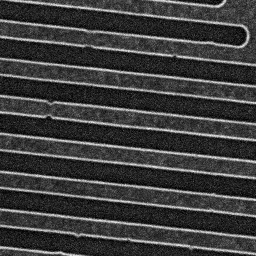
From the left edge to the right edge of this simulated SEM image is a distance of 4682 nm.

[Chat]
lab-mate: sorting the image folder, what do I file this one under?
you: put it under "parallel lines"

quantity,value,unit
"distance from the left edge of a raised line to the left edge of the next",686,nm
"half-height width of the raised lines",300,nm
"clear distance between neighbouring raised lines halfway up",386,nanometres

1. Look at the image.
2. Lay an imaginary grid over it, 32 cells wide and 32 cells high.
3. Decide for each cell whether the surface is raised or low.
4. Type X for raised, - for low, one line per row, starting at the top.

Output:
------XXXXXXXXXXXXXXXXXX----XXXX
---------------XXXXXXXXXXXXXXXXX
------------------------XXXXXXXX
XXXXXXXX-----------------------X
XXXXXXXXXXXXXXXXX--------------X
---------XXXXXXXXXXXXXXXXXX----X
-----------------XXXXXXXXXXXXXXX
XX------------------------XXXXXX
XXXXXXXXXXX---------------------
-XXXXXXXXXXXXXXXXXXX------------
----------XXXXXXXXXXXXXXXXXXX---
--------------------XXXXXXXXXXXX
XXXX-------------------------XXX
XXXXXXXXXXXXX-------------------
-----XXXXXXXXXXXXXXXXX----------
-------------XXXXXXXXXXXXXXXXXX-
-----------------------XXXXXXXXX
XXXXXXX-------------------------
XXXXXXXXXXXXXXXX----------------
------XXXXXXXXXXXXXXXXXXX-------
-----------------XXXXXXXXXXXXXXX
-------------------------XXXXXXX
XXXXXXXXX-----------------------
XXXXXXXXXXXXXXXXXX--------------
---------XXXXXXXXXXXXXXXXXX-----
------------------XXXXXXXXXXXXXX
XXX------------------------XXXXX
XXXXXXXXXXXX--------------------
---XXXXXXXXXXXXXXXXXX-----------
------------XXXXXXXXXXXXXXXXXX--
---------------------XXXXXXXXXXX
XXXXXX------------------------XX